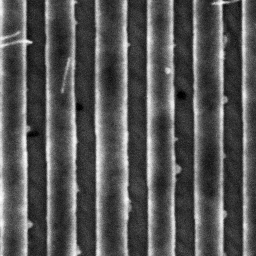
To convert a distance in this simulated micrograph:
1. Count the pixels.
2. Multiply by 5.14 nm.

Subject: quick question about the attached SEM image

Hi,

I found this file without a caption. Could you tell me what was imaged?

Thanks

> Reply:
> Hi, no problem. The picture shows lines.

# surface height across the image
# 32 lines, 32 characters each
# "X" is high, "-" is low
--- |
XXX---XXX---XXXX--XXXX--XXXX--XX
XXX---XXX---XXXX--XXXX--XXXX--XX
XXX---XXX---XXXX--XXXX--XXXX--XX
XXX---XXX---XXXX--XXXX--XXXX--XX
XXX---XXX---XXXX--XXXX--XXXX--XX
XXX---XXX---XXXX--XXXX--XXXX--XX
XXX---XXX---XXXX--XXXX--XXXX--XX
XXX---XXX---XXXX--XXXX--XXXX--XX
XXX---XXX---XXXX--XXXX--XXXX--XX
XXX---XXX---XXXX--XXXX--XXXX--XX
XXX---XXX---XXXX--XXXX--XXXX--XX
XXX---XXX---XXXX--XXXX--XXXX--XX
XXX---XXX---XXXX--XXXX--XXXX--XX
XXX---XXX---XXXX--XXXX--XXXX--XX
XXX---XXX---XXXX--XXXX--XXXX--XX
XXX---XXX---XXXX--XXXX--XXXX--XX
XXX---XXX---XXXX--XXXX--XXXX--XX
XXX---XXX---XXXX--XXXX--XXXX--XX
XXX---XXX---XXXX--XXXX--XXXX--XX
XXX---XXX---XXXX--XXXX--XXXX--XX
XXX---XXX---XXXX--XXXX--XXXX--XX
XXX---XXX---XXXX--XXXX--XXXX--XX
XXX---XXX---XXXX--XXXX--XXXX--XX
XXX---XXX---XXXX---XXX--XXXX--XX
XXX---XXX---XXXX---XXX--XXXX--XX
XXX---XXX---XXXX---XXX--XXXX--XX
XXX---XXX---XXXX---XXX--XXXX--XX
XXX---XXX---XXXX---XXX--XXXX--XX
XXX---XXX---XXXX---XXX--XXXX--XX
XXX---XXX---XXXX---XXX--XXXX--XX
XXX---XXX---XXXX---XXX--XXXX--XX
XXX---XXX---XXXX---XXX--XXXX--XX